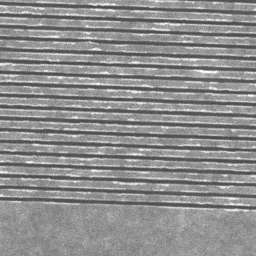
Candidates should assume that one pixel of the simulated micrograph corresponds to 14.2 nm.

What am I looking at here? parallel lines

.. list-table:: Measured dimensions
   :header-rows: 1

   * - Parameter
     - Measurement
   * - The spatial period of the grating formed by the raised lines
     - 163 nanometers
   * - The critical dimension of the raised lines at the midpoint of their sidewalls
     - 108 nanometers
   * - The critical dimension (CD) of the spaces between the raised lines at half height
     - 4.13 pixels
